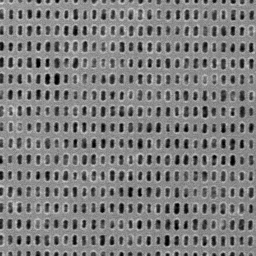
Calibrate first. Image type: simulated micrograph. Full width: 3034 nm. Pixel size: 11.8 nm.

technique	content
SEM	a regular array of holes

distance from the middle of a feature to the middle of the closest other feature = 107 nm